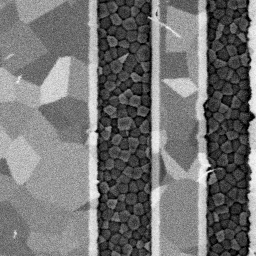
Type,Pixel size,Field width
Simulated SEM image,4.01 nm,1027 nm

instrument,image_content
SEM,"one or a few lines or trenches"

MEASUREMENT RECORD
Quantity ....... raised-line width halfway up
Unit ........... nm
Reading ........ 186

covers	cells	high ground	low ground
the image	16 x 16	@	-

@@@@@@----@@@---
@@@@@@----@@@---
@@@@@@----@@@---
@@@@@@----@@@---
@@@@@@----@@@---
@@@@@@----@@@---
@@@@@@----@@@---
@@@@@@----@@@---
@@@@@@----@@@---
@@@@@@----@@@---
@@@@@@----@@@---
@@@@@@----@@@---
@@@@@@----@@@---
@@@@@@----@@@---
@@@@@@----@@@---
@@@@@@----@@@---